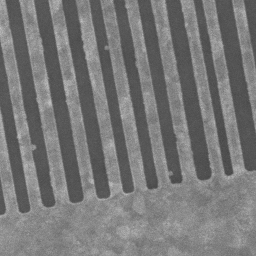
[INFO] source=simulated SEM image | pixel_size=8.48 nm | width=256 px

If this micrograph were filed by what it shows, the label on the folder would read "parallel lines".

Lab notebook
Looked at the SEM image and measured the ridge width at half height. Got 96 nm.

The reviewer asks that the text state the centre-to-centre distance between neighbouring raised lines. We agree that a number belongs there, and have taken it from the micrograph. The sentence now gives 219 nm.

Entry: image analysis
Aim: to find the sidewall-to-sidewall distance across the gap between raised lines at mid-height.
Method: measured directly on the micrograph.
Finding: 14.6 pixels